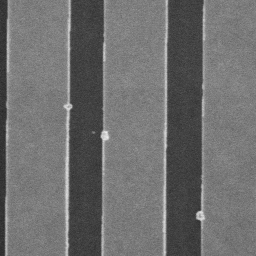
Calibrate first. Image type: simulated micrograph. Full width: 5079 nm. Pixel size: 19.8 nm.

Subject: lines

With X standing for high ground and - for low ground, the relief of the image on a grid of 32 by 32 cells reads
-XXXXXXXX----XXXXXXXX-----XXXXXX
-XXXXXXXX----XXXXXXXX----XXXXXXX
-XXXXXXXX----XXXXXXXX----XXXXXXX
-XXXXXXXX----XXXXXXXX----XXXXXXX
-XXXXXXXX----XXXXXXXX----XXXXXXX
-XXXXXXXX----XXXXXXXX----XXXXXXX
-XXXXXXXX----XXXXXXXX----XXXXXXX
-XXXXXXXX----XXXXXXXX----XXXXXXX
-XXXXXXXX----XXXXXXXX----XXXXXXX
-XXXXXXXX----XXXXXXXX----XXXXXXX
-XXXXXXXX----XXXXXXXX----XXXXXXX
-XXXXXXXX----XXXXXXXX----XXXXXXX
-XXXXXXXX----XXXXXXXX----XXXXXXX
-XXXXXXXX----XXXXXXXX----XXXXXXX
-XXXXXXXX----XXXXXXXX----XXXXXXX
-XXXXXXXX----XXXXXXXX----XXXXXXX
-XXXXXXXX----XXXXXXXX----XXXXXXX
-XXXXXXXX----XXXXXXXX----XXXXXXX
-XXXXXXXX----XXXXXXXX----XXXXXXX
-XXXXXXXX----XXXXXXXX----XXXXXXX
-XXXXXXXX----XXXXXXXX----XXXXXXX
-XXXXXXXX----XXXXXXXX----XXXXXXX
-XXXXXXXX----XXXXXXXX----XXXXXXX
-XXXXXXXX----XXXXXXXX----XXXXXXX
-XXXXXXX-----XXXXXXXX----XXXXXXX
-XXXXXXX-----XXXXXXXX----XXXXXXX
-XXXXXXX-----XXXXXXXX----XXXXXXX
-XXXXXXX-----XXXXXXXX----XXXXXXX
-XXXXXXX-----XXXXXXXX----XXXXXXX
-XXXXXXX-----XXXXXXXX----XXXXXXX
-XXXXXXX-----XXXXXXXX----XXXXXXX
-XXXXXXX-----XXXXXXXX----XXXXXXX